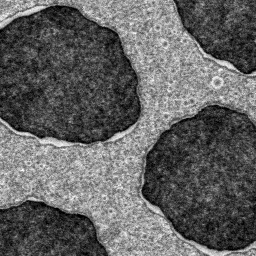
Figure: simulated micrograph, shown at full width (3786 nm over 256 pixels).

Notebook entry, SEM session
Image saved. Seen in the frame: holes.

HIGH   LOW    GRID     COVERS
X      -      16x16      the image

XXX--XXXXXX-----
------XXXXX-----
--------XXXX----
--------XXXXX---
--------XXXXXXX-
---------XXXXXXX
---------XXXXXXX
---------XX-----
XX-----XXX------
XXXXXXXXX-------
XXXXXXXXX-------
XXXXXXXXX-------
XXXXXXXXX-------
-----XXXXX------
------XXXXX-----
-------XXXXXX---